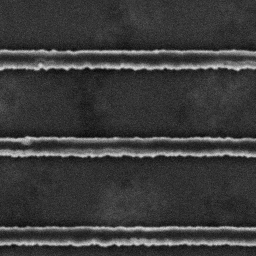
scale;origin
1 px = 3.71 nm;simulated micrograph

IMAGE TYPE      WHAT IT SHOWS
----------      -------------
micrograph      lines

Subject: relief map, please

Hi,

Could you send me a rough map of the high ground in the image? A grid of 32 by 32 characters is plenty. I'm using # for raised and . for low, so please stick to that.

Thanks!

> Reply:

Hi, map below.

................................
................................
................................
................................
................................
................................
################################
################################
#...##..#.....#.#######.#....#..
................................
................................
................................
................................
................................
................................
................................
................................
################################
################################
..........#....................#
................................
................................
................................
................................
................................
................................
................................
................................
####.##..####.##.#..#########...
################################
################################
................................